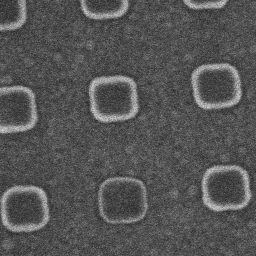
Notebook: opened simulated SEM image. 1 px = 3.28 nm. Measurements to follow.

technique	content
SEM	raised bodies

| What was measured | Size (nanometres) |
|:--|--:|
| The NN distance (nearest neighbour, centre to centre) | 339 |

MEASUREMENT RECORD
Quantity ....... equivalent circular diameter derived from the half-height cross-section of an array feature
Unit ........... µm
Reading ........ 0.15